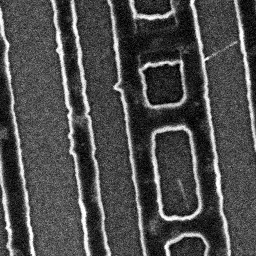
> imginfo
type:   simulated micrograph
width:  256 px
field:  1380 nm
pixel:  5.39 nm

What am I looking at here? parallel lines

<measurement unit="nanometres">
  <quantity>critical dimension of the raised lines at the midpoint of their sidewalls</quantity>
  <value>122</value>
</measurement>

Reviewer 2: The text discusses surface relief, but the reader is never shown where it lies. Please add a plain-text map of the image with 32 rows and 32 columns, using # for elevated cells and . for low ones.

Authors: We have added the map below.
.......##.....###....###.....###
.......##.....###....###......##
.......##.....###########.....##
.......###....###########.....##
#......###....###########.....##
#......###....###########.....##
#......###....###########.....##
#.......##.....##########.....##
#.......##.....###.....##......#
#.......##.....###.....###.....#
#.......###....###.....###.....#
##......###....###.....###.....#
##......###....###.....###.....#
##.......##.....##########.....#
##.......##.....##########.....#
##.......##.....##########.....#
##.......##.....####...####.....
##.......###....###.....###.....
##.......###....###.....###.....
###......###....###.....###.....
###......###.....##.....###.....
###.......##.....###....###.....
###.......##.....###.....##.....
###.......##.....###.....##.....
###.......##.....###.....###....
.##.......###....###.....###....
.###......###....###....####....
.###......###....###########....
.###......###.....##########....
.###.......##.....#####..###....
.###.......##.....###.....###...
.###.......###....###.....###...